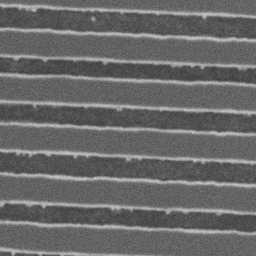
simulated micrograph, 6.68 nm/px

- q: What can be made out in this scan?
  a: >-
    lines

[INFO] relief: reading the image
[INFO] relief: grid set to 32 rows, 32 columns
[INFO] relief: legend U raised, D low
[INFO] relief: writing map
UUUUUUUUUUUUUUUUUUUUUUUUUUUUUUUU
DDDDDDDDDDDDDDDDDDUUUUUUUUUUUUUU
DDDDDDDDDDDDDDDDDDDDDDDDDDDDDDDD
DDDDDDDDDDDDDDDDDDDDDDDDDDDDDDDD
UUUUUUUUUUUUUUUUUUUUDDDDDDDDDDDD
UUUUUUUUUUUUUUUUUUUUUUUUUUUUUUUU
UUUUUUUUUUUUUUUUUUUUUUUUUUUUUUUU
DDDDDDDDDDDDDUUUUUUUUUUUUUUUUUUU
DDDDDDDDDDDDDDDDDDDDDDDDDDDDDDDD
UUUUUUUUDDDDDDDDDDDDDDDDDDDDDDDD
UUUUUUUUUUUUUUUUUUUUUUUUUUUUUUDD
UUUUUUUUUUUUUUUUUUUUUUUUUUUUUUUU
UUUUUUUUUUUUUUUUUUUUUUUUUUUUUUUU
DDDDDDDDDDDDDDDDDDUUUUUUUUUUUUUU
DDDDDDDDDDDDDDDDDDDDDDDDDDDDDDDD
UUUDDDDDDDDDDDDDDDDDDDDDDDDDDDDD
UUUUUUUUUUUUUUUUUUUUUUUUUDDDDDDD
UUUUUUUUUUUUUUUUUUUUUUUUUUUUUUUU
UUUUUUUUUUUUUUUUUUUUUUUUUUUUUUUU
DDDDDDDDDDDDDUUUUUUUUUUUUUUUUUUU
DDDDDDDDDDDDDDDDDDDDDDDDDDDDDDDD
DDDDDDDDDDDDDDDDDDDDDDDDDDDDDDDD
UUUUUUUUUUUUUUUUUDDDDDDDDDDDDDDD
UUUUUUUUUUUUUUUUUUUUUUUUUUUUUUUU
UUUUUUUUUUUUUUUUUUUUUUUUUUUUUUUU
DDDDDUUUUUUUUUUUUUUUUUUUUUUUUUUU
DDDDDDDDDDDDDDDDDDDDDDDDDDDUUUUU
DDDDDDDDDDDDDDDDDDDDDDDDDDDDDDDD
UUUUUUUUUUUUUUUUUUDDDDDDDDDDDDDD
UUUUUUUUUUUUUUUUUUUUUUUUUUUUUUUU
UUUUUUUUUUUUUUUUUUUUUUUUUUUUUUUU
DDUUUUUUUUUUUUUUUUUUUUUUUUUUUUUU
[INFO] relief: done